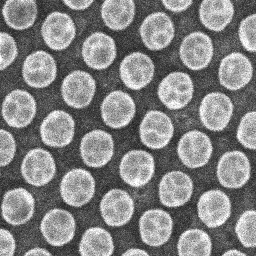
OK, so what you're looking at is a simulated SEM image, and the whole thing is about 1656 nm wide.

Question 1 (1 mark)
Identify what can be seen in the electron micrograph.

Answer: a regular array of raised bodies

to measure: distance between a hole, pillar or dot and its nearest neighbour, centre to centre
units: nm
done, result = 280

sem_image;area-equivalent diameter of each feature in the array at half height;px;33.8